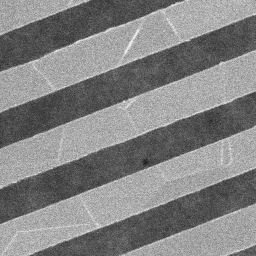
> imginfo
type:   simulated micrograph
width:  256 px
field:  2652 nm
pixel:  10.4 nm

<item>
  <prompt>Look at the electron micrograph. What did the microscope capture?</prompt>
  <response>one or a few lines or trenches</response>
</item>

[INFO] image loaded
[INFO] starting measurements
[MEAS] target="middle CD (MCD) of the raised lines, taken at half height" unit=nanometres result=392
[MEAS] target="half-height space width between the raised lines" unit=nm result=356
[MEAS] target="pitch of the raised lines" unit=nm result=741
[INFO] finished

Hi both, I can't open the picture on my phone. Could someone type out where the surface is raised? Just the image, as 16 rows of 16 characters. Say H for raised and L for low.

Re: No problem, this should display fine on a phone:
HHHHLLLLLLHHHHHH
HHLLLLLLHHHHHHLL
LLLLLHHHHHHHLLLL
LLLHHHHHHLLLLLLH
HHHHHHHLLLLLLHHH
HHHHLLLLLLHHHHHH
HLLLLLLHHHHHHHLL
LLLLLHHHHHHLLLLL
LLHHHHHHHLLLLLLH
HHHHHHLLLLLLHHHH
HHHLLLLLLHHHHHHH
HLLLLLLHHHHHHLLL
LLLLHHHHHHHLLLLL
LHHHHHHHLLLLLLHH
HHHHHLLLLLLHHHHH
HHHLLLLLLHHHHHHL